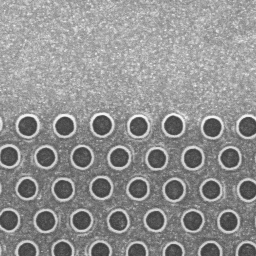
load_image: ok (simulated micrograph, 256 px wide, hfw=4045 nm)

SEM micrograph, a regular array of raised bodies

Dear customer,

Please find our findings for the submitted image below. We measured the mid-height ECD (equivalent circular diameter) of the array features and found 0.345 micrometres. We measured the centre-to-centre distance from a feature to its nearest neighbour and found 35.7 pixels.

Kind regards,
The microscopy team